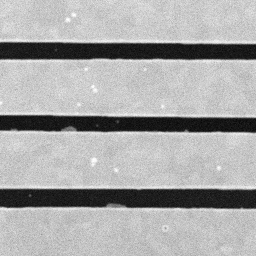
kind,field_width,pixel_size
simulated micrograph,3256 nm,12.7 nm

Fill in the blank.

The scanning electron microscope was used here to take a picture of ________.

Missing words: lines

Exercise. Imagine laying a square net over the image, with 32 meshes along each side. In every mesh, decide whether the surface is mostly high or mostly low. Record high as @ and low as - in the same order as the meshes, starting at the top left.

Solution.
@@@@@@@@@@@@@@@@@@@@@@@@@@@@@@@@
@@@@@@@@@@@@@@@@@@@@@@@@@@@@@@@@
@@@@@@@@@@@@@@@@@@@@@@@@@@@@@@@@
@@@@@@@@@@@@@@@@@@@@@@@@@@@@@@@@
@@@@@@@@@@@@@@@@@@@@@@@@@@@@@@@@
--------------------------------
--------------------------------
-----------@@@-----@------------
@@@@@@@@@@@@@@@@@@@@@@@@@@@@@@@@
@@@@@@@@@@@@@@@@@@@@@@@@@@@@@@@@
@@@@@@@@@@@@@@@@@@@@@@@@@@@@@@@@
@@@@@@@@@@@@@@@@@@@@@@@@@@@@@@@@
@@@@@@@@@@@@@@@@@@@@@@@@@@@@@@@@
@@@@@@@@@@@@@@@@@@@@@@@@@@@@@@@@
-------------@@@@@@@@@@@@@@@@@@@
--------------------------------
@@@@@@--------------------------
@@@@@@@@@@@@@@@@@@@@@@@@@@@@@@@@
@@@@@@@@@@@@@@@@@@@@@@@@@@@@@@@@
@@@@@@@@@@@@@@@@@@@@@@@@@@@@@@@@
@@@@@@@@@@@@@@@@@@@@@@@@@@@@@@@@
@@@@@@@@@@@@@@@@@@@@@@@@@@@@@@@@
@@@@@@@@@@@@@@@@@@@@@@@@@@@@@@@@
@@@@@@@@@@@@@@@@@@@@@@@@@@@@@@@@
--------------------------------
--------------------------------
@@@@@@@@@@@@@@@@@@@@@@@@@@@@@@@@
@@@@@@@@@@@@@@@@@@@@@@@@@@@@@@@@
@@@@@@@@@@@@@@@@@@@@@@@@@@@@@@@@
@@@@@@@@@@@@@@@@@@@@@@@@@@@@@@@@
@@@@@@@@@@@@@@@@@@@@@@@@@@@@@@@@
@@@@@@@@@@@@@@@@@@@@@@@@@@@@@@@@